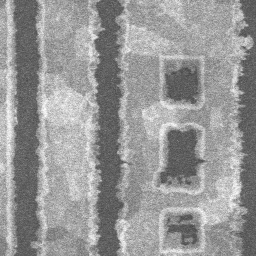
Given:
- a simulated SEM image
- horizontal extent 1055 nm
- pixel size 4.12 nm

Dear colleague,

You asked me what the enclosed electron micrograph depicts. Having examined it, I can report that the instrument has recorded one or a few lines or trenches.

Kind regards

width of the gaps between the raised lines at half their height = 140 nm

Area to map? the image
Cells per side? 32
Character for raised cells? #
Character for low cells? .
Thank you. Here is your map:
#....######.....##############..
#....#######....##############..
#....#######....##############..
#....######.....#############...
#....#######....#############...
#....######.....###############.
#....######.....##############..
#....######....#####.....####...
#.....#####.....####.....#####..
#....#######...#####.....#####..
#....#######....####.....####...
#....######.....####.....####...
#....######....#####.....####...
#....#######...###############..
#....######....##############...
#....######.....#############...
#....######.....####.....####...
#....######.....####.....####...
#....######.....####.....####...
#....######.....####.....####...
#.....######....####......###...
#....#######....####.....#####..
#.....#####.....###......####...
#.....#####....#####.....#####..
#....######....##############...
#....#######....#############...
#....#######....#####....#####..
#....######....#####.....####...
#.....######....####.....####...
#....#######...#####.....####...
#....######....#####.....####...
#....######.....##############..